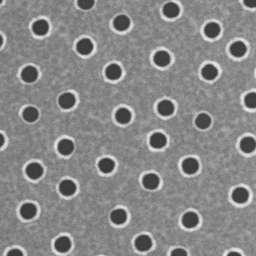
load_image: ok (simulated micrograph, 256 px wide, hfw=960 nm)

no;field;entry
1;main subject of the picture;a regular array of holes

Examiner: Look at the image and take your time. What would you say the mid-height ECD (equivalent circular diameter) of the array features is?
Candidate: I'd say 66.8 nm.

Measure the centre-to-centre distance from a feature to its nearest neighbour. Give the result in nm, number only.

148